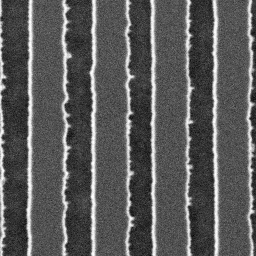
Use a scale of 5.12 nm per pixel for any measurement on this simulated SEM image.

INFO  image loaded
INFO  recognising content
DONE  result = lines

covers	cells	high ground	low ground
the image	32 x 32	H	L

LLLLHHHHLLLLHHHHLLLHHHHHLLLHHHHL
LLLLHHHHLLLLHHHHLLLHHHHHLLLHHHHL
LLLLHHHHLLLLHHHHLLLHHHHHLLLHHHHL
LLLLHHHHLLLLHHHHLLLHHHHHLLLHHHHL
LLLLHHHHLLLLHHHHLLLHHHHHLLLHHHHL
LLLLHHHHLLLLHHHHLLLHHHHHLLLHHHHL
LLLLHHHHLLLLHHHHLLLHHHHHLLLHHHHH
LLLLHHHHLLLLHHHHLLLHHHHHLLLHHHHH
LLLLHHHHLLLLHHHHLLLHHHHHLLLHHHHL
LLLLHHHHLLLHHHHHLLLHHHHHLLLHHHHL
LLLLHHHHLLLLHHHHLLLHHHHHLLLHHHHL
LLLLHHHHLLLLHHHHLLLHHHHHLLLHHHHL
LLLLHHHHLLLLHHHHLLLHHHHHLLLHHHHL
LLLLHHHHLLLLHHHHLLLHHHHHLLLHHHHL
LLLLHHHHLLLLHHHHLLLHHHHHLLLHHHHL
LLLLHHHHLLLLHHHHLLLHHHHHLLLHHHHL
LLLLHHHHLLLLHHHHLLLHHHHHLLLHHHHL
LLLLHHHHLLLLHHHHLLLHHHHHLLLHHHHL
LLLLHHHHLLLLHHHHLLLHHHHHLLLHHHHL
LLLLHHHHLLLLHHHHLLLHHHHHLLLHHHHL
LLLLHHHHLLLLHHHHLLLHHHHHLLLHHHHL
LLLLHHHHLLLLHHHHLLLHHHHHLLLHHHHL
LLLLHHHHLLLLHHHHLLLHHHHHLLLHHHHL
LLLLHHHHLLLLHHHHLLLHHHHHLLLHHHHL
LLLLHHHHLLLLHHHHLLLHHHHLLLLHHHHH
LLLLHHHHLLLLHHHHLLLHHHHHLLLHHHHH
LLLLHHHHLLLLHHHHLLLHHHHHLLLHHHHL
LLLLHHHHLLLLHHHHLLLHHHHHLLLHHHHL
LLLLHHHHLLLLHHHHLLLHHHHHLLLHHHHH
LLLLHHHHLLLLHHHHLLLHHHHHLLLHHHHL
LLLLHHHHLLLLHHHHLLLHHHHHLLLHHHHH
LLLLHHHHLLLLHHHHLLLHHHHHLLLHHHHH